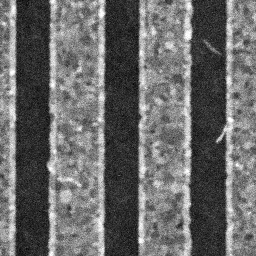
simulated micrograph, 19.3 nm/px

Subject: one or a few lines or trenches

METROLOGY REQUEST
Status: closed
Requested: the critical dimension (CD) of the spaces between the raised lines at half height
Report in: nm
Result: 785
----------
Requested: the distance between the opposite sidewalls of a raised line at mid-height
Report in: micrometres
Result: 0.904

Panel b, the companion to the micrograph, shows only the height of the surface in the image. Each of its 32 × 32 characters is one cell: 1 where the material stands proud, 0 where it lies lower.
11000001111110000011111100000111
11000001111110000011111100000111
10000001111110000011111000000111
11000001111110000011111100000111
11000001111110000011111100000111
11000001111110000011111000000111
11000001111110000011111000000111
11000001111110000011111000000111
11000001111110000011111100000111
11000001111110000011111000000111
11000001111110000011111000000111
11000001111110000011111000000111
11000001111110000011111000000111
10000001111110000011111000000111
11000001111110000011111000000111
11000001111110000011111000000111
10000001111110000011111000000111
10000001111110000011111000000111
11000001111110000011111000000111
11000001111110000011111000000111
11000011111110000011111000000111
11000001111110000011111000000111
11000001111110000011111000000111
11000001111110000011111000000111
11000001111110000011111000000111
11000001111110000011111000000111
11000011111110000011111000000111
11000001111110000011111000000111
11000001111110000011111000000111
11000001111110000011111000000111
11000011111110000011111000000111
10000001111110000011111000000111